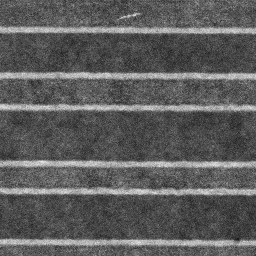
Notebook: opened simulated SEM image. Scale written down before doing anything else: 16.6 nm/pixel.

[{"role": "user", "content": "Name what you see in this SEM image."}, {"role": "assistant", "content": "one or a few lines or trenches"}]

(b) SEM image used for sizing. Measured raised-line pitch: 1360 nanometres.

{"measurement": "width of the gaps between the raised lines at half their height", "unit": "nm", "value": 482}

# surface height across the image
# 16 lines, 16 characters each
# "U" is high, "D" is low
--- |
DDDDDDDDDDDDDDDD
DDDDDDDDDDDDDDDD
UUUUUUUUUUUUUUUU
UUUUUUUUUUUUUUUU
UUUUUUUUUUUUUUUU
DDDDDDDDDDDDDDDD
DDDDDDDDDDDDDDDD
UUUUUUUUUUUUUUUU
UUUUUUUUUUUUUUUU
UUUUUUUUUUUUUUUU
DDDDDDDDDDDDDDDD
DDDDDDDDDDDDDDDD
UUUUUUUUUUUUUUUU
UUUUUUUUUUUUUUUU
UUUUUUUUUUUUUUUU
DDDDDDDDDDDDDDDD